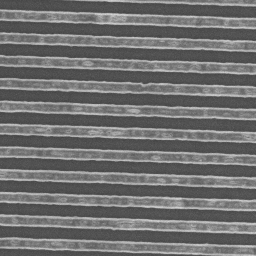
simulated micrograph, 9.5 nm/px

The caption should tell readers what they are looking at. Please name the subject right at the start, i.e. parallel lines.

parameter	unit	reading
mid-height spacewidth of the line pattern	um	0.134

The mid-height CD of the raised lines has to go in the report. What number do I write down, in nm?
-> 89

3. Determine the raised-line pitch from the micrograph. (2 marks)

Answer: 22.8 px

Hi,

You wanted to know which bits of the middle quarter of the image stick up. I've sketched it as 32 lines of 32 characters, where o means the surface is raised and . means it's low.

oooooooooooooooooooooooooooooooo
....................oooooooooooo
................................
................................
oooo............................
oooooooooooooooooooooooooooooooo
oooooooooooooooooooooooooooooooo
..............................oo
................................
................................
ooooooo.oooooo..................
oooooooooooooooooooooooooooooooo
..........oooooooooooooooooooooo
................................
................................
................................
oooooooooooooooooooooooo........
oooooooooooooooooooooooooooooooo
....................oooooooooooo
................................
................................
oooo............................
oooooooooooooooooooooooooooooooo
oooooooooooooooooooooooooooooooo
..............................oo
................................
................................
ooooooooo.oooo..................
oooooooooooooooooooooooooooooooo
..........oooooooooooooooooooooo
................................
................................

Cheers